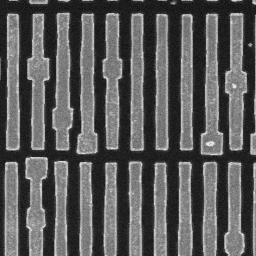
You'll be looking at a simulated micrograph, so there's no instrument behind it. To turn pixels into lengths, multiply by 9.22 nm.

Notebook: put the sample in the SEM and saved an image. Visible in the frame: wiring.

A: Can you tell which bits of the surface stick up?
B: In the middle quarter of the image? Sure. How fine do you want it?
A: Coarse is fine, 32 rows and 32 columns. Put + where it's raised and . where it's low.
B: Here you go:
+...+++...++++...+++...+++...+++
+...+++...++++...+++...+++...+++
+...+++...++++...+++...+++...+++
+...+++...++++...+++...+++...+++
+...+++....++....+++...+++...+++
+...+++....++....++....+++...+++
+...+++....++....++....+++...+++
+...+++....++....++....+++...+++
+...+++....+++...+++...+++...+++
+...+++....+++...+++...+++...+++
+...+++....+++...+++...+++...+++
++..+++....+++...+++...+++...+++
++..+++....+++...+++...+++...+++
++..+++....+++...+++...+++...+++
++..+++....+++...+++...+++...+++
++..+++....+++...+++...+++...+++
+...+++....++....+++...+++...+++
+...++++...++....+++...+++...+++
+...++++...++....+++...+++...+++
+...++++...++....+++...+++...+++
+...++++...++....+++...+++...+++
....++++........................
................................
................................
................................
+...+++....++...+++....++....+++
+...+++....++...+++....++....+++
+...+++....++....++....++....+++
+...+++....++....++....++....+++
+...+++....++....++....++....+++
+...+++....++....++....++....+++
+...+++....++....++....++....+++